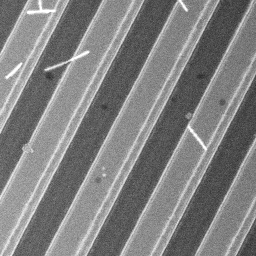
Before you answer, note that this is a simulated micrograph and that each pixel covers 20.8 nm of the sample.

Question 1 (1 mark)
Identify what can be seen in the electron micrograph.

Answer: lines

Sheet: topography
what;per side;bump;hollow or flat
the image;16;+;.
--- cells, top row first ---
..++..+++..++...
.+++..++..+++..+
.++..+++..++...+
++...++..+++..++
++..+++..++...++
+...++..+++..+++
+..+++..++..+++.
...++..+++..++..
..+++..++..+++..
.+++..+++..++...
.+++..++..+++..+
+++..+++..++...+
++...++..+++..++
++..+++..++...++
+...++..+++..++.
+..+++..++..+++.